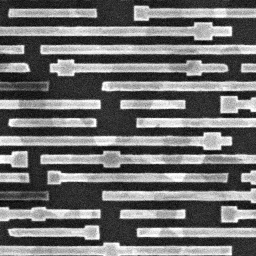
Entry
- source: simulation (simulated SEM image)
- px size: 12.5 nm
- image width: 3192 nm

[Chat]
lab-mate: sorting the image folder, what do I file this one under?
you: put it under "wiring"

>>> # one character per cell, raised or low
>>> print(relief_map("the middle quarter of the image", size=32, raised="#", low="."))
################################
################################
##.............................#
................................
................................
..........######################
..........###############...####
................................
................................
#########.....################..
#########.....################..
................................
................................
................................
########..........##############
########..........##############
................................
................................
################################
################################
................................
................................
..........####..................
################################
################################
..........####..................
................................
################################
################################
................................
................................
................................